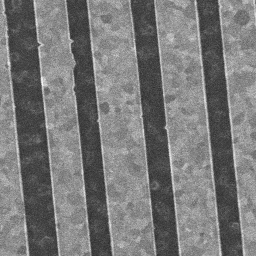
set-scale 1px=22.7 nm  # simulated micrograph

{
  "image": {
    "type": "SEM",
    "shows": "one or a few lines or trenches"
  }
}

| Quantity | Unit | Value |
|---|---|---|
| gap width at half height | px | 24.4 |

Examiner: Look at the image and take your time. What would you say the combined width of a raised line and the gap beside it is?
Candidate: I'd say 1410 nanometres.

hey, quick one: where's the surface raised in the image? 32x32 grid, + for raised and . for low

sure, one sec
....++++...+++++...+++++...+++++
....++++...+++++....+++++..+++++
+....+++...++++++...+++++...++++
+....++++..++++++...+++++...++++
+....++++..++++++...+++++...++++
+....++++...+++++...+++++...++++
+....++++...+++++...+++++...++++
+....++++...+++++...+++++...++++
+....++++...+++++...+++++...++++
+....++++...+++++...+++++...++++
+....++++...+++++...+++++...++++
+....++++...+++++....++++....+++
++....+++...+++++....+++++...+++
++....++++..++++++...+++++...+++
++....++++..++++++...+++++...+++
++....++++..++++++...+++++...+++
++....++++...+++++...+++++...+++
++....++++...+++++...+++++...+++
++....++++...+++++...+++++...+++
++....++++...+++++...+++++...+++
++....++++...+++++...+++++...+++
++....++++...+++++...+++++...+++
+++...++++...+++++....+++++...++
+++....+++...++++++...+++++...++
+++....++++..++++++...+++++...++
+++....++++...+++++...+++++...++
+++....++++...+++++...+++++...++
+++....++++...+++++...+++++...++
+++....++++...+++++...+++++...++
+++....++++...+++++...+++++...++
+++....++++...+++++...+++++...++
+++....++++...+++++...+++++....+